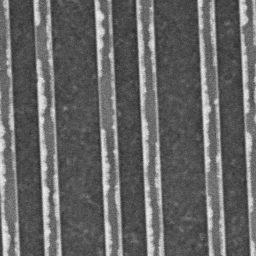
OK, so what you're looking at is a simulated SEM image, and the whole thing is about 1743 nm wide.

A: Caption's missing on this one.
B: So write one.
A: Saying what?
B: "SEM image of parallel lines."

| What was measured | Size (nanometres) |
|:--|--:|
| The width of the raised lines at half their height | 109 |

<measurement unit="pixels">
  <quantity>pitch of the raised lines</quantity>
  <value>53.8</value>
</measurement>